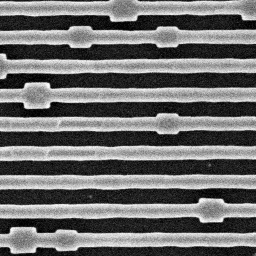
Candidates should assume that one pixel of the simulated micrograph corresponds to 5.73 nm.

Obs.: wiring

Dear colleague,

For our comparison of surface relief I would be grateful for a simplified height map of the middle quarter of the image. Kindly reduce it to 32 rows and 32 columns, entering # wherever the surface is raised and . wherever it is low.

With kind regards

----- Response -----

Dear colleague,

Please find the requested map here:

################################
################################
................................
................................
................................
................................
################################
################################
################################
................................
................................
................................
................................
##############...###############
################################
################################
################################
................................
................................
................................
................................
################################
################################
################################
................................
................................
................................
................................
################################
################################
################################
................................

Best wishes